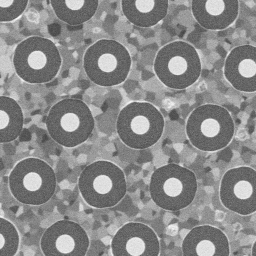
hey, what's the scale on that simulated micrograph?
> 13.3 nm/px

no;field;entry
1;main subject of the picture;an array of small figures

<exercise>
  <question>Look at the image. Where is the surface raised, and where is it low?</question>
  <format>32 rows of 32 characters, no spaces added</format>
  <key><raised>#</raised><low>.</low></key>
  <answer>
...###......###......###......##
...####.....###......###......##
..######...#####....####.....###
##########################..####
################################
##.....#####...######...########
##.....####.....####.....####...
##......##......###......###....
##......###.....###......###....
##.....####.....####.....###....
############...#####....#####...
################################
..######..######################
...###.....####.....#####...####
...###......###.....####.....###
...###......###......##......###
...###.....####.....###......###
..#####....####.....####.....###
################..#######...####
################################
##....#####...#######.##########
#......###.....####.....####....
#......###......###......###....
#......###......###......##.....
##.....###......###.....###.....
###..######....####.....####....
#############################...
.###############################
..####....#####....#####...#####
..###......###......###.....####
..###......###......###......###
..###......###......###......##.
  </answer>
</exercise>